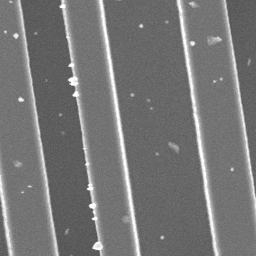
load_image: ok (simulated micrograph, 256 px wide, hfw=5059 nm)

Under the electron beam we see lines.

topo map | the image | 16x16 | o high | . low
o...oo.....ooo..
o...oo.....ooo..
oo..ooo.....oo..
oo..ooo.....ooo.
oo...oo.....ooo.
oo...oo.....ooo.
oo...oo.....ooo.
oo...oo.....ooo.
oo...ooo....ooo.
ooo..ooo.....oo.
ooo..ooo.....ooo
ooo...oo.....ooo
ooo...oo.....ooo
ooo...oo.....ooo
ooo...oo.....ooo
.oo...ooo.....oo